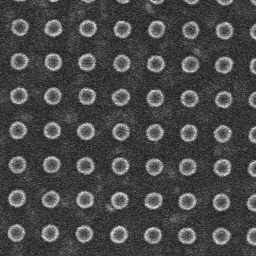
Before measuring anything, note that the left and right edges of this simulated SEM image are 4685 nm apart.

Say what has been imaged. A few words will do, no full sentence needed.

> a regular array of raised bodies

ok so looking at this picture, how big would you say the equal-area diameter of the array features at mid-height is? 0.283 µm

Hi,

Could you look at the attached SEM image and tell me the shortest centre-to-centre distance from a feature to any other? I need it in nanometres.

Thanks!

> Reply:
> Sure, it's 620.